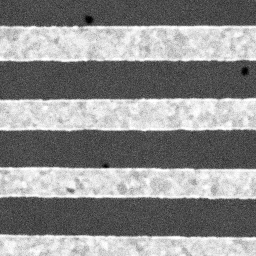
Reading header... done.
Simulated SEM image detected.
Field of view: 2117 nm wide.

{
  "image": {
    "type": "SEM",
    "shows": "lines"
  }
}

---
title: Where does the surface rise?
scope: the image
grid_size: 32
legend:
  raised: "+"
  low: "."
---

................................
................................
................................
++++++++++++++++++++++++++++++++
++++++++++++++++++++++++++++++++
++++++++++++++++++++++++++++++++
++++++++++++++++++++++++++++++++
+++++..++++.+...++...+++...++...
................................
................................
................................
................................
.....................++++.+.++.+
++++++++++++++++++++++++++++++++
++++++++++++++++++++++++++++++++
++++++++++++++++++++++++++++++++
................................
................................
................................
................................
................................
++++++++++++++++++++++++++++++++
++++++++++++++++++++++++++++++++
++++++++++++++++++++++++++++++++
+....+++++++++++++++++++++++++++
................................
................................
................................
................................
+++.............................
++++++++++++++++++++++++++++++++
++++++++++++++++++++++++++++++++